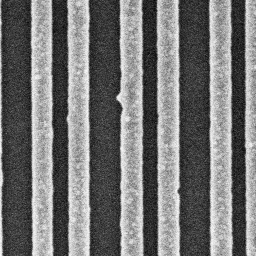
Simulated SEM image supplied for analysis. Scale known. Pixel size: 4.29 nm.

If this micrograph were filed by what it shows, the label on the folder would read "parallel lines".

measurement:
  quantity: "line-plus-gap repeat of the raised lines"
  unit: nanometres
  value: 192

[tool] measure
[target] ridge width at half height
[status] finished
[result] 87.8 nm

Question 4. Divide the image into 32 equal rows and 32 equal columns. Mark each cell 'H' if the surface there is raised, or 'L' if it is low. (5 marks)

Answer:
LLLLHHLLHHHLLLLHHHLLHHLLLLHHHLLH
LLLLHHLLLHHLLLLHHHLLHHLLLLHHHLLH
LLLLHHLLLHHLLLLHHHLLHHLLLLHHHLLH
LLLLHHLLLHHLLLLHHHLLHHLLLLHHHLLH
LLLLHHLLLHHLLLLHHHLLHHLLLLHHHLLH
LLLLHHLLLHHLLLLHHHLLHHLLLLHHHLLH
LLLLHHLLLHHLLLLHHHLLHHLLLLHHHLLH
LLLLHHLLLHHLLLLHHHLLHHLLLLHHHLLH
LLLLHHLLLHHLLLLHHHLLHHLLLLHHHLLH
LLLLHHLLLHHLLLLHHHLLHHLLLLHHHLLH
LLLLHHLLLHHLLLLHHHLLHHLLLLHHHLLH
LLLLHHLLLHHLLLLHHHLLHHLLLLHHHLLH
LLLLHHLLLHHLLLLHHHLLHHLLLLHHHLLH
LLLLHHLLLHHLLLLHHHLLHHLLLLHHHLLH
LLLLHHLLHHHLLLLHHHLLHHLLLLHHHLLH
LLLLHHLLLHHLLLLHHHLLHHLLLLHHHLLH
LLLLHHHLLHHLLLLHHHLLHHLLLLHHHLLH
LLLLHHLLLHHLLLLHHHLLHHLLLLHHHLLH
LLLLHHLLLHHLLLLHHHLLHHLLLLHHHLLH
LLLLHHLLLHHLLLLHHHLLHHLLLLHHHLLH
LLLLHHLLLHHLLLLHHHLLHHLLLLHHHLLH
LLLLHHLLLHHLLLLHHHLLHHLLLLHHHLLH
LLLLHHLLLHHLLLLHHHLLHHLLLLHHHLLH
LLLLHHHLLHHLLLLHHHLLHHLLLLHHHLLH
LLLLHHHLLHHLLLLHHHLLHHLLLLHHHLLH
LLLLHHHLLHHLLLLHHHLLHHLLLLHHHLLH
LLLLHHHLLHHLLLLHHHLLHHLLLLHHHLLH
LLLLHHLLLHHLLLLHHHLLHHLLLLHHHLLH
LLLLHHHLLHHLLLLHHHLLHHLLLLHHHLLH
LLLLHHHLLHHLLLLHHHLLHHLLLLHHHLLH
LLLLHHHLLHHLLLLHHHLLHHLLLLHHHLLH
LLLLHHHLLHHLLLLHHHLLHHLLLLHHHLLH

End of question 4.